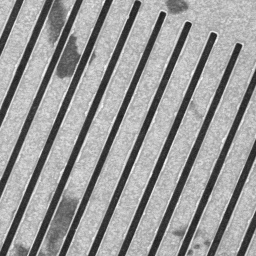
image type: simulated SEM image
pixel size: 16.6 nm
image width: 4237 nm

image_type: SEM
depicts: parallel lines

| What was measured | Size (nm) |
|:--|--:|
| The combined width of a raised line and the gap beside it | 455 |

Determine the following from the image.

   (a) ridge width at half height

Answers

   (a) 328 nm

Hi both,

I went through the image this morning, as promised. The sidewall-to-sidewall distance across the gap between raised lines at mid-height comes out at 128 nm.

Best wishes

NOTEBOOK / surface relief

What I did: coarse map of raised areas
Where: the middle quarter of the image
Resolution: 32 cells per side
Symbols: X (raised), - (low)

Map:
XXX---XXXXX--XXXXX--XXXXXX--XXXX
XXX--XXXXX---XXXXX--XXXXX--XXXXX
XXX--XXXXX--XXXXXX-XXXXXX--XXXXX
XX--XXXXXX--XXXXX--XXXXX--XXXXXX
XX--XXXXX--XXXXXX--XXXXX--XXXXX-
X--XXXXXX--XXXXX--XXXXX---XXXXX-
X--XXXXX---XXXXX--XXXXX--XXXXXX-
---XXXXX--XXXXX--XXXXXX--XXXXX--
--XXXXXX--XXXXX--XXXXX--XXXXXX--
--XXXXX--XXXXXX--XXXXX--XXXXX--X
-XXXXXX--XXXXX--XXXXXX--XXXXX--X
-XXXXX--XXXXXX--XXXXX--XXXXX---X
-XXXXX--XXXXX--XXXXXX--XXXXX--XX
XXXXX---XXXXX--XXXXX--XXXXXX--XX
XXXXX--XXXXX--XXXXXX--XXXXX--XXX
XXXXX--XXXXX--XXXXXX-XXXXXX--XXX
XXXX--XXXXXX--XXXXX--XXXXX---XXX
XXXX--XXXXX--XXXXXX--XXXXX--XXXX
XXX---XXXXX--XXXXX--XXXXXX--XXXX
XXX--XXXXX--XXXXXX--XXXXX--XXXXX
XX---XXXXX--XXXXX--XXXXXX--XXXXX
XX--XXXXXX-XXXXXX--XXXXX--XXXXXX
XX--XXXXX--XXXXXX--XXXXX--XXXXX-
X--XXXXXX--XXXXX--XXXXX---XXXXX-
X--XXXXX--XXXXXX--XXXXX--XXXXX--
---XXXXX--XXXXX--XXXXXX--XXXXX--
--XXXXX--XXXXXX--XXXXX--XXXXXX--
--XXXXX--XXXXXX-XXXXXX--XXXXX--X
-XXXXXX--XXXXX--XXXXX---XXXXX--X
-XXXXX--XXXXXX--XXXXX--XXXXX---X
XXXXXX--XXXXX--XXXXXX--XXXXX--XX
XXXXX--XXXXXX--XXXXX--XXXXXX--XX